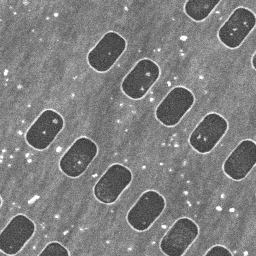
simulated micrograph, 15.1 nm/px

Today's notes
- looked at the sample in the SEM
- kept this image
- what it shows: a regular array of holes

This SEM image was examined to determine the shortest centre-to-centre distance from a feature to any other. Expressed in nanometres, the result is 653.